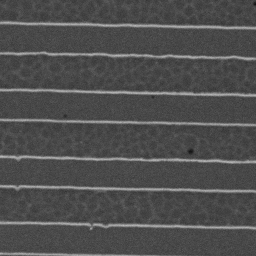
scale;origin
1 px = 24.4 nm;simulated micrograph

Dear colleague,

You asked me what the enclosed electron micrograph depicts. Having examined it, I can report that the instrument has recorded one or a few lines or trenches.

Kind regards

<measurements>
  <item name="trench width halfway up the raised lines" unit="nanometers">909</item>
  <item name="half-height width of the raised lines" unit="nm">720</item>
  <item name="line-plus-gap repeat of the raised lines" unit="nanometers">1630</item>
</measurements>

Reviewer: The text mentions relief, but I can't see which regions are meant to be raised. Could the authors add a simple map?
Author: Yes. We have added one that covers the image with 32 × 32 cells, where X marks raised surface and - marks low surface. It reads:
--------------------------------
--------------------------------
--------------------------------
XXXXXXXXXXXXXXXXXXXXXXXXXXXX-X--
XXXXXXXXXXXXXXXXXXXXXXXXXXXXXXXX
XXXXXXXXXXXXXXXXXXXXXXXXXXXXXXXX
XXXXXXXXXXXXXXXXXXXXXXXXXXXXXXXX
--------------------------------
--------------------------------
--------------------------------
--------------------------------
XXXXXXXX------------------------
XXXXXXXXXXXXXXXXXXXXXXXXXXXXXXXX
XXXXXXXXXXXXXXXXXXXXXXXXXXXXXXXX
XXXXXXXXXXXXXXXXXXXXXXXXXXXXXXXX
-----------------------------XXX
--------------------------------
--------------------------------
--------------------------------
--------------------------------
XXXXXXXXXXXXXXXXXXXXXXXXXXXXXXXX
XXXXXXXXXXXXXXXXXXXXXXXXXXXXXXXX
XXXXXXXXXXXXXXXXXXXXXXXXXXXXXXXX
-------------XXXXXXXXXXXXXXXXXXX
--------------------------------
--------------------------------
--------------------------------
--------------------------------
XXXXXXXXXXXXXXXXXXXXXXXXXXXXXX--
XXXXXXXXXXXXXXXXXXXXXXXXXXXXXXXX
XXXXXXXXXXXXXXXXXXXXXXXXXXXXXXXX
XXXXXXXXXXXXXXXXXXXXXXXXXXXXXXXX